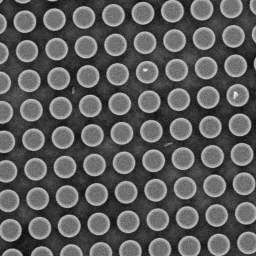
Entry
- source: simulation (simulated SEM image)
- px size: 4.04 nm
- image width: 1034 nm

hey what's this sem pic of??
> an array of small figures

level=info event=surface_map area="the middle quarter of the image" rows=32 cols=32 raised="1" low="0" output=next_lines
00000110000011100001111000111110
00001111000111110011111001111110
10011111100111110011111000111110
10011111100111110011111000111100
10001111000011100001110000000000
10000110000000000000000000000000
00000000000000000000000000011100
00000000000001100001111000111110
00000111100011110001111100111110
10001111100111111001111100111110
11001111100111111001111100111110
11001111100011110000111000001100
10000111000001100000000000000000
00000000000000000000000000000000
00000000000000000000111000011110
00000011000011111001111100011111
11000111110011111001111100011111
11001111110011111001111110011111
11001111110011111000111100001110
11000111100001110000010000000000
11000001000000000000000000000000
00000000000000000000000000001110
00000000000001111000111110011111
11000111110001111000111110011111
11100111110011111100111110011111
11100111110011111100111110001111
11100111110001111000011100000000
11000011100000000000000000000000
00000000000000000000000000000110
00000000000000010000011110001111
11000011110001111100111110001111
11100011111001111100111111001111